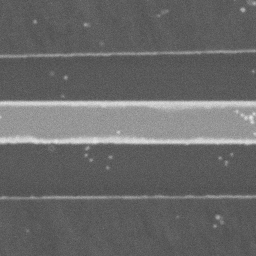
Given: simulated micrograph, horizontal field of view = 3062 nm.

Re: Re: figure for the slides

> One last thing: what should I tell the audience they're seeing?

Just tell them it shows lines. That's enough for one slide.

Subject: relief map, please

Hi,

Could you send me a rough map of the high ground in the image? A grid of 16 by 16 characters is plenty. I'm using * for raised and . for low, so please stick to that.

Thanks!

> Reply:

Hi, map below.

****************
****************
****************
**..............
................
................
****************
****************
****************
................
................
................
****************
****************
****************
****************